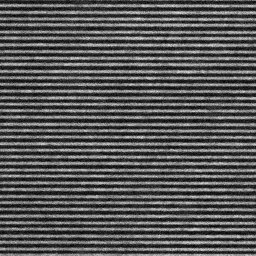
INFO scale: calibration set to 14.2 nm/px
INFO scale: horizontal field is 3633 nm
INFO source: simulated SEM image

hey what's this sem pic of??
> parallel lines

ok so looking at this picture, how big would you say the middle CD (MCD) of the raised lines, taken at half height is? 33.7 nanometres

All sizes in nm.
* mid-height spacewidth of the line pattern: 60.3